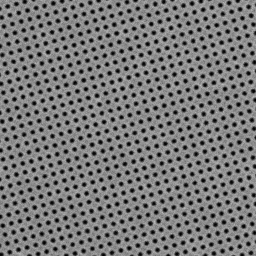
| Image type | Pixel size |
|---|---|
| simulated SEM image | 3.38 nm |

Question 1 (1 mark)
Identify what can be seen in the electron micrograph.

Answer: a regular array of holes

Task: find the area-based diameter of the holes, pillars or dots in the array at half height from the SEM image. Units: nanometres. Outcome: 16.2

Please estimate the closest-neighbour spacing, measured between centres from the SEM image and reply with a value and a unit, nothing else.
29.7 nanometers